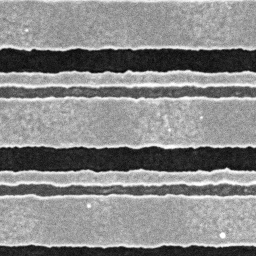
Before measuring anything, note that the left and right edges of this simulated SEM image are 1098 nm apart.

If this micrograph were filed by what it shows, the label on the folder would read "lines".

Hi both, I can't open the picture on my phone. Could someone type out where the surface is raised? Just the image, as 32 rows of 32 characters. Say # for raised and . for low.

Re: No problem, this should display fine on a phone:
################################
################################
################################
################################
################################
################################
................................
................................
................................
################################
################################
################################
################################
################################
################################
################################
################################
################################
.......#....#...##..##..........
................................
................................
#####....###.##.####....########
################################
################################
################################
################################
################################
################################
################################
################################
################################
................................